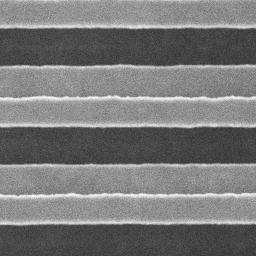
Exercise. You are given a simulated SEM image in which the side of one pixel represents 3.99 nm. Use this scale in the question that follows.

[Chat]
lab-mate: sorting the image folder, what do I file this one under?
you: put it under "lines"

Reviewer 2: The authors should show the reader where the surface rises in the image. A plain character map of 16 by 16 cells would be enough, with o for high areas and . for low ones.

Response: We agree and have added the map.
oooooooooooooooo
oooooooooooooooo
................
................
oooooooooooooooo
oooooooooooooooo
oooooooooooooooo
oooooooooooooooo
................
................
oooooooooooooooo
oooooooooooooooo
oooooooooooooooo
oooooooooooooooo
................
................